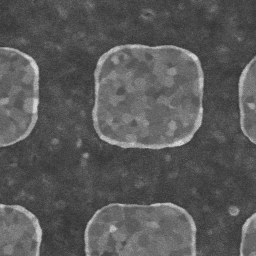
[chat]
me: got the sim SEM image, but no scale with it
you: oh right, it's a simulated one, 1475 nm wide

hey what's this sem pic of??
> raised bodies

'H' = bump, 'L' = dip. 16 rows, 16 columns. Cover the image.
LLLLLLLLLLLLLLLL
LLLLLLLLLLLLLLLL
LLLLLLLLLLLLLLLL
HHLLLLLHHHHHLLLL
HHLLLLHHHHHHHLLH
HHLLLLHHHHHHHLLH
HHLLLLHHHHHHHLLH
HHLLLLHHHHHHLLLH
HHLLLLHHHHHHLLLH
LLLLLLLLLLLLLLLL
LLLLLLLLLLLLLLLL
LLLLLLLLLLLLLLLL
LLLLLLLLLLLLLLLL
HHLLLLHHHHHHLLLL
HHLLLHHHHHHHLLLH
HHLLLHHHHHHHLLLH